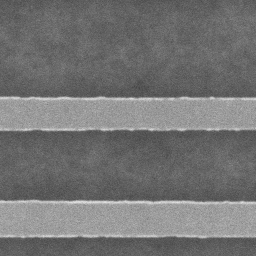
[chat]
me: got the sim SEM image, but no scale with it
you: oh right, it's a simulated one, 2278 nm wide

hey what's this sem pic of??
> lines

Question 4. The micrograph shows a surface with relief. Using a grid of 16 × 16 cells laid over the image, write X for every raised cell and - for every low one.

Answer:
----------------
----------------
----------------
----------------
----------------
----------------
XXXXXXXXXXXXXXXX
XXXXXXXXXXXXXXXX
----------------
----------------
----------------
----------------
----------------
XXXXXXXXXXXXXXXX
XXXXXXXXXXXXXXXX
----------------